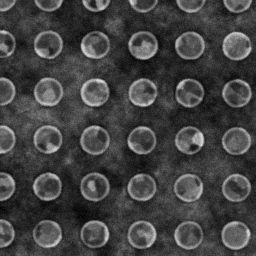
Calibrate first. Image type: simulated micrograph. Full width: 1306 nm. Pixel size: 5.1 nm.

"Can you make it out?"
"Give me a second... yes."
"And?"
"a regular array of raised bodies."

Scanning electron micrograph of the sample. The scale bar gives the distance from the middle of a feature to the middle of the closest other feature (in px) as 46.9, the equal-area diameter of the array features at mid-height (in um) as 0.136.